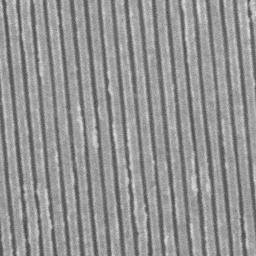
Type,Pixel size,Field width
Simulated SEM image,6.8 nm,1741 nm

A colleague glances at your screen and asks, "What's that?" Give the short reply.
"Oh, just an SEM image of parallel lines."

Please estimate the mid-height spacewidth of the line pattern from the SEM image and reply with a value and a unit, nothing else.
35.5 nanometres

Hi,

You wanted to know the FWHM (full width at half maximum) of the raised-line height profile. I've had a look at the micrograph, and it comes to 53.3 nanometers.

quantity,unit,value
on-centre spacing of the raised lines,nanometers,92